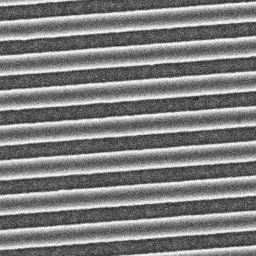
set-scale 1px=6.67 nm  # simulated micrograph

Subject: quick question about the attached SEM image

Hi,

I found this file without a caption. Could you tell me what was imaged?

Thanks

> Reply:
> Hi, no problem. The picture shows parallel lines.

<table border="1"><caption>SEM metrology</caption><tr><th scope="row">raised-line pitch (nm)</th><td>232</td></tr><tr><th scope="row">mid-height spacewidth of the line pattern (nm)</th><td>103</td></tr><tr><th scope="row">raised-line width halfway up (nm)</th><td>127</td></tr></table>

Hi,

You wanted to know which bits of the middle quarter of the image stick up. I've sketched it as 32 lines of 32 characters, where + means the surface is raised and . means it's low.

++++++++++++++..................
+...............................
................................
............................++++
...............+++++++++++++++++
..++++++++++++++++++++++++++++++
++++++++++++++++++++++++++++++++
++++++++++++++++++++++++++++++++
+++++++++++++++++++++++++.......
+++++++++.++....................
................................
................................
.......................+++++++++
..........++++++++++++++++++++++
++++++++++++++++++++++++++++++++
++++++++++++++++++++++++++++++++
++++++++++++++++++++++++++++++++
+++++++++++++++++++++...........
++++++++........................
................................
................................
.....................+++++++++++
........++++++++++++++++++++++++
++++++++++++++++++++++++++++++++
++++++++++++++++++++++++++++++++
+++++++++++++++++++++++++++++...
+++++++++++++++++...............
+++.............................
................................
..............................++
..............+..+++++++++++++++
..++++++++++++++++++++++++++++++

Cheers